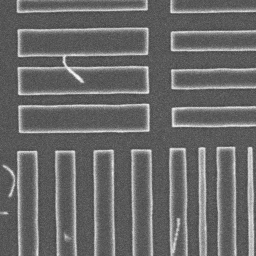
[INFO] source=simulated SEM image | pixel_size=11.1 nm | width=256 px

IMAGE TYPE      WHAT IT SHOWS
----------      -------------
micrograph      groups of lines, slits or small figures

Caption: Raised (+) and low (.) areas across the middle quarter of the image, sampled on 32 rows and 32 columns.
+...............................
+++++++++++++++++++++......+.+++
+++++++++++++++++++++......+++++
+++++++++++++++++++++......+++++
+++++++++++++++++++++......+++++
+++++++++++++++++++++......+++++
+++++++++++++++++++++...........
................................
................................
................................
+++++++++++++++++++++...........
+++++++++++++++++++++......+++++
+++++++++++++++++++++......+++++
+++++++++++++++++++++......+++++
+++++++++++++++++++++......+++++
+++++++++++++++++++++...........
+++++++++++++++++++++...........
................................
................................
................................
................................
.................+++++.....+++..
+++.....++++.....+++++.....+++..
+++.....++++.....+++++.....+++..
+++.....++++.....+++++....++++..
+++.....++++.....+++++....++++..
+++.....++++.....+++++....++++..
+++.....++++.....+++++....++++..
+++.....++++.....+++++.....++++.
+++.....++++.....+++++.....++++.
+++.....++++.....+++++.....++++.
+++.....++++.....+++++.....++++.